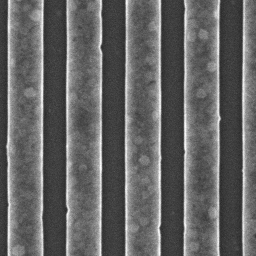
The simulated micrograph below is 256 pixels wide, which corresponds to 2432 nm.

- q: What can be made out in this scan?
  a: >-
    parallel lines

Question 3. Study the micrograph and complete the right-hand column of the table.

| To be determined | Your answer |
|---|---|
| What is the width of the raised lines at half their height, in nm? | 323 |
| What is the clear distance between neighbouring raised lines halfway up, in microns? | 0.234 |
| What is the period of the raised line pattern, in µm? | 0.558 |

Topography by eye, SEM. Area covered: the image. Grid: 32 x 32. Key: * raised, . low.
.****...*****...****...****....*
.****...*****...****...****....*
.****...*****...****...****...**
.****...*****...****...****...**
.****...*****...****...****...**
.****...*****...****...****...**
.****...*****...****...****...**
.****...*****...****...****...**
.****...*****...****...****...**
.****...*****...****...****...**
.****...*****...****...****...**
.****...*****...****...****...**
.****...*****...****...****...**
.****...*****...****...****...**
.****...*****...****...****...**
.****...*****...****...****...**
.****...*****...****...****...**
.****...*****...****...****...**
.****...*****...****...****...**
.****...*****...****...****...**
.****...*****...****...****...**
.****...*****...****...****...**
.****...*****...****...****...**
.****...*****...****...****...**
.****...*****...****...****...**
.****...*****...****...****...**
.****....****...****...****...**
.****...*****...****...****...**
.****...*****...****...****...**
.****...*****...****...****...**
.****...*****...****...****...**
.****...*****...****...****...**